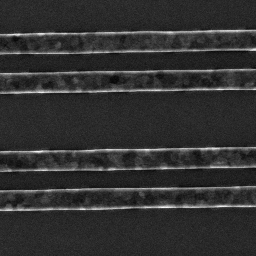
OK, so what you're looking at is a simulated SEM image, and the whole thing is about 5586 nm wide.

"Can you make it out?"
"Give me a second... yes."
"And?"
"wiring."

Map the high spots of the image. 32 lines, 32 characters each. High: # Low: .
................................
................................
................................
................................
################################
################################
################................
................................
................................
################################
################################
############....................
................................
................................
................................
................................
................................
................................
.........................#######
################################
################################
................................
................................
.....................###########
################################
################################
................................
................................
................................
................................
................................
................................